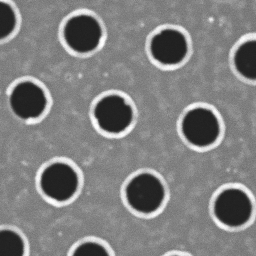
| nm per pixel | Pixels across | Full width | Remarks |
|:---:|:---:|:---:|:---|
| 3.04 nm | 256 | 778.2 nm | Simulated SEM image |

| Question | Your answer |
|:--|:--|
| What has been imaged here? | a regular array of holes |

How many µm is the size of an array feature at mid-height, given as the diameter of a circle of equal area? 0.112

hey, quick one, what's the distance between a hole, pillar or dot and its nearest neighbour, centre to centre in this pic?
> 0.262 microns